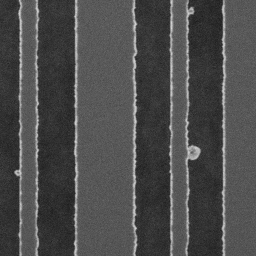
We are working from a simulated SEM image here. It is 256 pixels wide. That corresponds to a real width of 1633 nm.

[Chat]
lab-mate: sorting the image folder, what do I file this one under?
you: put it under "lines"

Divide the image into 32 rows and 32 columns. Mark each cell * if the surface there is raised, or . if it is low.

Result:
...**....********....**.....****
..***....********....**.....****
...**....********....**.....****
...**....********....**.....****
...**....********....**.....****
...**....********....**.....****
...**....********....**.....****
...**....********....**.....****
...**....********....**.....****
...**....********....***....****
...**....********....**.....****
...**....********....**.....****
..***....********....***....****
...**....********....**.....****
...**....********....**.....****
...**....********....**.....****
..***....********....**.....****
...**....********....**.....****
...**....********....***....****
...**....********....***....****
...**....********....**.....****
..***....********....**.....****
...**....********....**.....****
...**....********....***....****
...**....********....***....****
...**....********....**.....****
...**....********....**.....****
...**....********....**.....****
...**....********....**.....****
..***....********....***....****
...**....********....**.....****
...**....********....**.....****